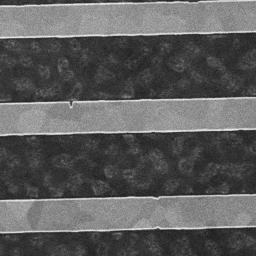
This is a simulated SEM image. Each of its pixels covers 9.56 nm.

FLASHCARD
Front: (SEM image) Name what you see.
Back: one or a few lines or trenches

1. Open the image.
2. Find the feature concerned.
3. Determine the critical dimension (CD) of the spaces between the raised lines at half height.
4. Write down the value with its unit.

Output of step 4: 0.627 µm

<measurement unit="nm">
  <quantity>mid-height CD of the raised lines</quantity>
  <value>301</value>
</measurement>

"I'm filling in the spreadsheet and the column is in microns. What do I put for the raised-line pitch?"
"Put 0.93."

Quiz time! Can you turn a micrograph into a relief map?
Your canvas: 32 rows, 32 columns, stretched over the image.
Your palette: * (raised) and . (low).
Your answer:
.............*******************
********************************
********************************
********************************
******.**.......................
................................
................................
................................
................................
................................
................................
................................
....................**.*********
********************************
********************************
********************************
***********..****...............
................................
................................
................................
................................
................................
................................
............*...................
............................****
********************************
********************************
********************************
*******************.*.****......
................................
................................
................................